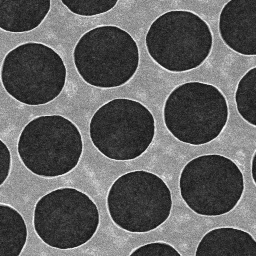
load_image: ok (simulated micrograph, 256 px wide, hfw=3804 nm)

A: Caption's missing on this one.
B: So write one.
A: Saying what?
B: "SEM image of a regular array of holes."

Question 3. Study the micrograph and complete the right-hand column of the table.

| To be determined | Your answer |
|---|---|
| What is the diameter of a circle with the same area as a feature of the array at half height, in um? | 0.938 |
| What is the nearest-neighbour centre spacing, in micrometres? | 1.1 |